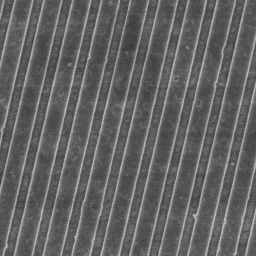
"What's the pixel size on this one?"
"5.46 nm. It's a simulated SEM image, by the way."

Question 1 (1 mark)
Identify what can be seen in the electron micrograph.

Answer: parallel lines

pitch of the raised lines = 154 nm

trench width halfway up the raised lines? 55.3 nanometers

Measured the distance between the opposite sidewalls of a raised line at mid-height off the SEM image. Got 99.8 nanometres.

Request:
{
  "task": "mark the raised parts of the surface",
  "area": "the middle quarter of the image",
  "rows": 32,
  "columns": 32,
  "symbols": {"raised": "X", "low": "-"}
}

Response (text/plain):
XXX---XXXX---XXXX---XXXXX--XXXXX
XXX--XXXXX--XXXXX---XXXX---XXXXX
XX---XXXXX--XXXXX---XXXX---XXXX-
XX---XXXXX--XXXXX--XXXXX---XXXX-
XX---XXXX---XXXX---XXXXX--XXXXX-
XX---XXXX---XXXX---XXXXX--XXXXX-
XX--XXXXX--XXXXX---XXXX---XXXX--
X---XXXXX--XXXXX--XXXXX---XXXX--
X---XXXX---XXXX---XXXXX--XXXXX--
X---XXXX---XXXX---XXXXX--XXXXX--
X--XXXXX--XXXXX---XXXX---XXXXX--
X--XXXXX--XXXXX--XXXXX---XXXX---
---XXXX---XXXXX--XXXXX---XXXX---
---XXXX---XXXX---XXXXX--XXXXX---
--XXXXX---XXXX---XXXX---XXXXX--X
--XXXXX--XXXXX---XXXX---XXXX---X
--XXXXX--XXXXX--XXXXX---XXXX---X
--XXXX---XXXX---XXXXX--XXXXX---X
--XXXX---XXXX---XXXX---XXXXX--XX
-XXXXX--XXXXX---XXXX---XXXXX--XX
-XXXXX--XXXXX--XXXXX---XXXX---XX
-XXXX---XXXXX--XXXXX--XXXXX---XX
-XXXX---XXXX---XXXXX--XXXXX--XXX
XXXXX--XXXXX---XXXX---XXXXX--XXX
XXXXX--XXXXX--XXXXX---XXXX---XXX
XXXXX--XXXXX--XXXXX---XXXX---XXX
XXXX---XXXX---XXXXX--XXXXX---XXX
XXXX---XXXX---XXXX---XXXXX--XXXX
XXXX--XXXXX---XXXX---XXXX---XXXX
XXXX--XXXXX--XXXXX---XXXX---XXXX
XXX---XXXX---XXXXX--XXXXX---XXXX
XXX---XXXX---XXXX---XXXXX--XXXXX